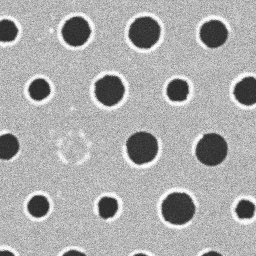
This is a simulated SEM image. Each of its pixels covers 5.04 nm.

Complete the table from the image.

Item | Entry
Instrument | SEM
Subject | a regular array of holes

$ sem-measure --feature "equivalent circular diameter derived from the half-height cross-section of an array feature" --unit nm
149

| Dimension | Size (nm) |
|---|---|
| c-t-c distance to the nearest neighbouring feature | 340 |